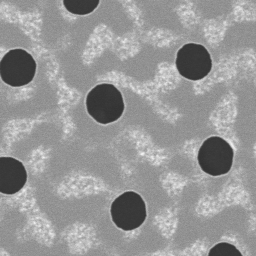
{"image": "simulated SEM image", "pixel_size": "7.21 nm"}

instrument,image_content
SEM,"holes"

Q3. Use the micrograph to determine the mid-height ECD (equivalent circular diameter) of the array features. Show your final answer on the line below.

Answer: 270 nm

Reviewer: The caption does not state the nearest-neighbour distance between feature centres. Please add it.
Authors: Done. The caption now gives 704 nanometers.